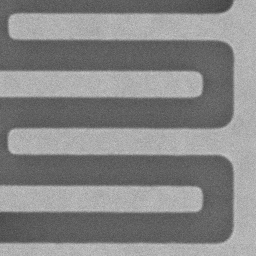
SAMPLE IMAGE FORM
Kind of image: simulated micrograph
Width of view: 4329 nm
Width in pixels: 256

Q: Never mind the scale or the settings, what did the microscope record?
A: groups of lines, slits or small figures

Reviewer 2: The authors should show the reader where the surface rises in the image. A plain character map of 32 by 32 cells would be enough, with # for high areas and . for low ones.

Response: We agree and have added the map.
.............................###
............................####
.###############################
.###############################
.###############################
.............................###
.............................###
.............................###
.............................###
#########################....###
#########################....###
#########################....###
.............................###
.............................###
.............................###
.............................###
.###############################
.###############################
.###############################
............................####
.............................###
.............................###
.............................###
#########################....###
#########################....###
#########################....###
.............................###
.............................###
.............................###
.............................###
#######################....#####
################################